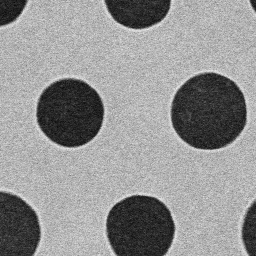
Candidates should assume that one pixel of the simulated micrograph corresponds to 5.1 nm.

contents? holes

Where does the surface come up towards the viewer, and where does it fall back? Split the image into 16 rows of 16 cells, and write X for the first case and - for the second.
-XXXXXX----XXXXX
XXXXXXXX--XXXXXX
XXXXXXXXXXXXXXXX
XXXXXXXXXXXXXXXX
XXXXXXXXXXXXXXXX
XXX---XXXXX----X
XX----XXXXX----X
XX----XXXXX----X
XXX---XXXXX----X
XXXXXXXXXXXXXXXX
XXXXXXXXXXXXXXXX
XXXXXXXXXXXXXXXX
-XXXXXXX--XXXXXX
--XXXXX----XXXX-
--XXXXX----XXXX-
--XXXXX----XXXX-